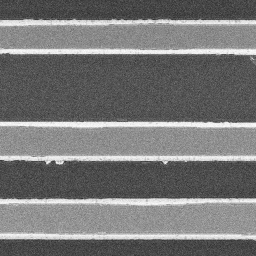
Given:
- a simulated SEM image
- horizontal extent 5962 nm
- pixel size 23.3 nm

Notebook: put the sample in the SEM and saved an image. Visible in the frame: lines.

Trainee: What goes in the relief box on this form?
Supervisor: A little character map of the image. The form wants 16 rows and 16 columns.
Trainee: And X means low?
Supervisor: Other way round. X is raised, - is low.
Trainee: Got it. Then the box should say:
----------------
XXXXXXXXXXXXXXXX
XXXXXXXXXXXXXXXX
----------------
----------------
----------------
----------------
----------------
XXXXXXXXXXXXXXXX
XXXXXXXXXXXXXXXX
----------------
----------------
----------------
XXXXXXXXXXXXXXXX
XXXXXXXXXXXXXXXX
----------------